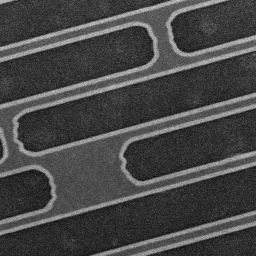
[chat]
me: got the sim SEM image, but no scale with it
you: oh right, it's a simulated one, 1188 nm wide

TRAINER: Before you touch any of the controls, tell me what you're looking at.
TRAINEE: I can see parallel lines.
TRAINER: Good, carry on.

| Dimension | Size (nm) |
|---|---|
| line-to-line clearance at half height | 210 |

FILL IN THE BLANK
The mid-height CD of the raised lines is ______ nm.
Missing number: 50.3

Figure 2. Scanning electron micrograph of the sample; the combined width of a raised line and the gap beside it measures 55.8 pixels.